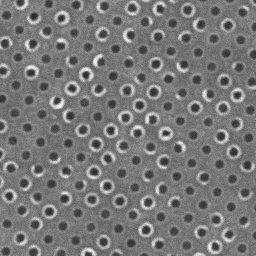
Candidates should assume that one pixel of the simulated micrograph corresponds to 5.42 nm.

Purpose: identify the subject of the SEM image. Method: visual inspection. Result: a regular array of holes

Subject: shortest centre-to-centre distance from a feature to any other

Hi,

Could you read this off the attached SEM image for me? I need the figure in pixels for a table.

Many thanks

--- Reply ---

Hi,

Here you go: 19.1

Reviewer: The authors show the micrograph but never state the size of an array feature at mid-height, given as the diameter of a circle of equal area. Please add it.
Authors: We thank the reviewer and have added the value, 9.63 pixels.